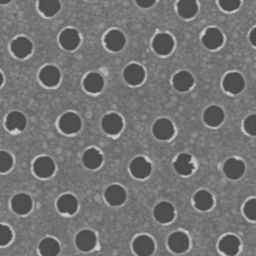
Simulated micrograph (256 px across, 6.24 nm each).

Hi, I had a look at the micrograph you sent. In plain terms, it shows a regular array of holes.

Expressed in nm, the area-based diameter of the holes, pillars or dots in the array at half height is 136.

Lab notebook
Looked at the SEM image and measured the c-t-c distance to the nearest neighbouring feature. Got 254 nanometers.